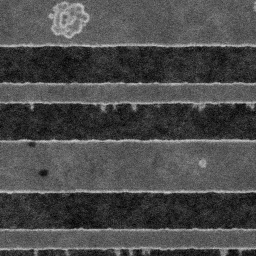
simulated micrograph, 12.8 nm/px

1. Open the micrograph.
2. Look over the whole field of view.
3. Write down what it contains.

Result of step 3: lines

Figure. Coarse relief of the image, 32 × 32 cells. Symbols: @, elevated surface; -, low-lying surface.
@@@@@@@@@@@@@@@@@@@@@@@@@@@@@@@@
@@@@@@@@@@@@@@@@@@@@@@@@@@@@@@@@
@@@@@@@@@@@@@@@@@@@@@@@@@@@@@@@@
@@@@@@@@@@@@@@@@@@@@@@@@@@@@@@@@
@@@@@@@@@@@@@@@@@@@@@@@@@@@@@@@@
@@@@@@@@@@@@@@@@@@@@@@@@@@@@@@@@
--------------------------------
--------------------------------
--------------------------------
--------------------------------
@@@@@@@@@@@@@@@@@@@@@@@@@@@@@@@@
@@@@@@@@@@@@@@@@@@@@@@@@@@@@@@@@
@@@@@@@@@@@@@@@@@@@@@@@@@@@@@@@@
--------------------------------
--------------------------------
--------------------------------
--------------------------------
--------------------------------
@@@@@@@@@@@@@@@@@@@@@@@@@@@@@@@@
@@@@@@@@@@@@@@@@@@@@@@@@@@@@@@@@
@@@@@@@@@@@@@@@@@@@@@@@@@@@@@@@@
@@@@@@@@@@@@@@@@@@@@@@@@@@@@@@@@
@@@@@@@@@@@@@@@@@@@@@@@@@@@@@@@@
@@@@@@@@@@@@@@@@@@@@@@@@@@@@@@@@
--------------------------------
--------------------------------
--------------------------------
--------------------------------
--------------------------------
@@@@@@@@@@@@@@@@@@@@@@@@@@@@@@@@
@@@@@@@@@@@@@@@@@@@@@@@@@@@@@@@@
--------------------------------